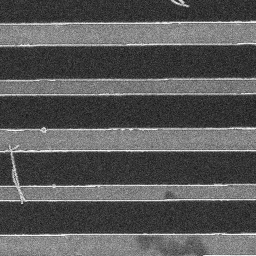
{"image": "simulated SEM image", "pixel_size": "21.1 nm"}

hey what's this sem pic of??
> lines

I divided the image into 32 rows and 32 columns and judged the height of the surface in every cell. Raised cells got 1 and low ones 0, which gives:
11111111111111111111111111111111
11111111111111111111111111111111
11111111111111111111111111111111
00000000000000000000000000000000
00000000000000000000000000000000
00000000000000000000000000000111
11111111111111111111111111111111
11111111111111111111111111111111
11111111111111111111111111111111
11111111111111111111111111111111
00000000000000000000000000000000
00000000000000000000000000000000
11111111111111111111111111111111
11111111111111111111111111111111
11111111111111111111111111111111
11111111111111111111111111111111
00000000000000000000000000000000
00000000000000000000000000000000
00000000000000000000000000000000
11111111111111111111111111111111
11111111111111111111111111111111
11111111111111111111111111111111
11111111111111111111111111111111
00000000000000000000000000000000
00000000000000000000000000000000
11111111111111111111111111111111
11111111111111111111111111111111
11111111111111111111111111111111
11111111111111111111111111111111
00000000000000000000000000000000
00000000000000000000000000000000
00000000000000000000000000000000